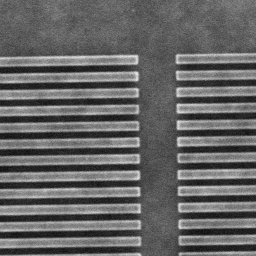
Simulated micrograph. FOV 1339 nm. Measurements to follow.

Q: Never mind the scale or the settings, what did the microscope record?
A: groups of lines, slits or small figures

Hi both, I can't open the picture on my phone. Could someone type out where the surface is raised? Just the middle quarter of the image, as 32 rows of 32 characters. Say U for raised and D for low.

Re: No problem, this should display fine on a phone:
DDDDDDDDDDDDDDDDDDDDDDDDDDDDDDDD
DDDDDDDDDDDDDDDDDDDDDDDDDDDDDDDD
UUUUUUUUUUUUUUUUUUDDDDDDDDDDUUUU
UUUUUUUUUUUUUUUUUUDDDDDDDDDDUUUU
DDDDDDDDDDDDDDDDDDDDDDDDDDDDDDDD
DDDDDDDDDDDDDDDDDDDDDDDDDDDDDDDD
UUUUUUUUUUUUUUUUUUDDDDDDDDDDUUUU
UUUUUUUUUUUUUUUUUUDDDDDDDDDDUUUU
UUUDDDDDDDDDDDDDDDDDDDDDDDDDDDDD
DDDDDDDDDDDDDDDDDDDDDDDDDDDDDDDD
DDDDDDDDDUUUUUUUUUDDDDDDDDDDUUUU
UUUUUUUUUUUUUUUUUUDDDDDDDDDDUUUU
UUUUUUUUUUUUUDDDDDDDDDDDDDDDDDDD
DDDDDDDDDDDDDDDDDDDDDDDDDDDDDDDD
DDDDDDDDDDDDDDDDDDDDDDDDDDDDUUUU
UUUUUUUUUUUUUUUUUUDDDDDDDDDDUUUU
UUUUUUUUUUUUUUUUUUDDDDDDDDDDDDDD
DDDDDDDDDDDDDDDDDDDDDDDDDDDDDDDD
DDDDDDDDDDDDDDDDDDDDDDDDDDDDDUUU
UUUUUUUUUUUUUUUUUUUDDDDDDDDDUUUU
UUUUUUUUUUUUUUUUUUUDDDDDDDDDDUUU
DDDDDDDDDDDDDDDDDDDDDDDDDDDDDDDD
DDDDDDDDDDDDDDDDDDDDDDDDDDDDDDDD
UUUUUUUUUUUUUUUUUUUDDDDDDDDDDUUU
UUUUUUUUUUUUUUUUUUUDDDDDDDDDDDDD
DDDDDDDDDDDDDDDDDDDDDDDDDDDDDDDD
DDDDDDDDDDDDDDDDDDDDDDDDDDDDDDDD
UUUUUUUUUUUUUUUUUUUDDDDDDDDDDUUU
UUUUUUUUUUUUUUUUUUUDDDDDDDDDDUUU
DDDDDDDDDDDDDDDDDDDDDDDDDDDDDDDD
DDDDDDDDDDDDDDDDDDDDDDDDDDDDDDDD
UUUUUUUUUUUUUUUUUUUDDDDDDDDDDUUU